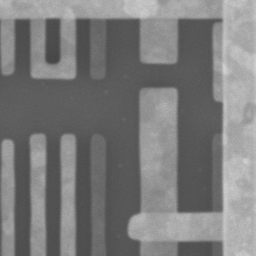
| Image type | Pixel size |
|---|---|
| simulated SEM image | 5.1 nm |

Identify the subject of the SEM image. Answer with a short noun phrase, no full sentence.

wiring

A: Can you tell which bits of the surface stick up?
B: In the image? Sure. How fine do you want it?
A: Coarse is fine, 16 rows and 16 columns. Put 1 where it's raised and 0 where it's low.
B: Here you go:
1111111111111111
0000000000000011
0000000000000011
0000000000000011
0000000000000011
0000000000000011
0000000000000011
0000000000000011
0000000000000011
0000000000000011
0000000000000011
0000000000000011
0000000000000011
0000000001111111
0000000011111111
0000000000000011